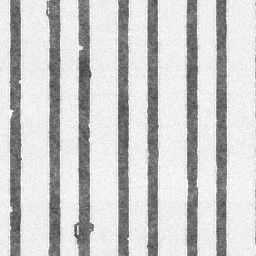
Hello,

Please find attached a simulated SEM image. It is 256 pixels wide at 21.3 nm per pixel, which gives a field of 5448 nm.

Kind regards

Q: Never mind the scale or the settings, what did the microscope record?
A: parallel lines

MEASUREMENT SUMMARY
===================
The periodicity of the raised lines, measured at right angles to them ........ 34.3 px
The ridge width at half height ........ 253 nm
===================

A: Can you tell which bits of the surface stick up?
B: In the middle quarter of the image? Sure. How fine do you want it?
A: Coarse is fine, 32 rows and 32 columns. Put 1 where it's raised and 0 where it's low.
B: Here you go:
00001100000001110000011100000001
00001110000001110000011000000001
00001110000001110000011000000001
00001110000001110000011000000001
00001110000001110000011000000001
00001110000001110000011100000001
00001100000001110000011100000001
00001100000001110000011100000001
00001100000001110000011100000001
00001100000001110000011100000001
00011110000001110000011100000001
00001110000001110000011100000001
00001100000001110000011100000001
00001100000001110000011100000001
00001100000001110000011100000001
00001100000001110000011100000001
00001100000001110000011100000001
00001100000001110000011100000001
00011100000001110000011100000001
00011100000001110000011100000001
00001100000001110000011100000001
00001100000001110000011100000001
00001100000001110000011100000001
00001100000001110000011100000001
00001100000001110000011100000001
00001100000001110000011100000001
00001100000001110000011100000001
00001100000001110000011100000001
00001110000001110000011100000001
00001110000001110000011100000001
00001110000001110000011100000001
00001100000001110000011100000001